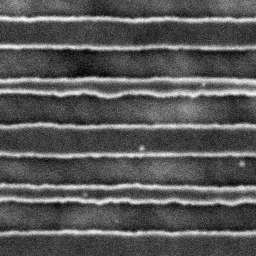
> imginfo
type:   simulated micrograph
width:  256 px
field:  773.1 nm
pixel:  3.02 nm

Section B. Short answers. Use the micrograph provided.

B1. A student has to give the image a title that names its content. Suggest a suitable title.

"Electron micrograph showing lines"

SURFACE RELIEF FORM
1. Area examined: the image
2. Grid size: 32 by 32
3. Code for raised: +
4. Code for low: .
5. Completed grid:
................................
................................
++++++++++++++++++++++++++++++++
++++++++++++++++++++++++++++++++
++++++++++++++++++++++++++++++++
++++++++++++++++++++++++++++++++
................................
................................
................................
................................
++++++++++++++++++++++++++++++++
++++++++++++++++++++++++++++++++
................................
................................
................................
....+++.........................
++++++++++++++++++++++++++++++++
++++++++++++++++++++++++++++++++
++++++++++++++++++++++++++++++++
..+.+++++++++...++..............
................................
................................
................................
++++++++++++++++++++++++++++++++
++++++++++++++++++++++++++++++++
............................+...
................................
................................
................................
++++++++++++++++++++++++++++++++
++++++++++++++++++++++++++++++++
++++++++++++++++++++++++++++++++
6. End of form